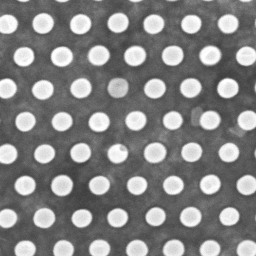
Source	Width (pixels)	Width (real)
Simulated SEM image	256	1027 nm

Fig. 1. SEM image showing a regular array of raised bodies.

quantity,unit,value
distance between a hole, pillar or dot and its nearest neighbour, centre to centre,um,0.146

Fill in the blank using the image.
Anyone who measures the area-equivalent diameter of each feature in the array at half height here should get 0.0787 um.